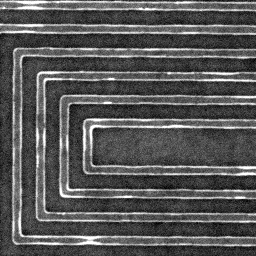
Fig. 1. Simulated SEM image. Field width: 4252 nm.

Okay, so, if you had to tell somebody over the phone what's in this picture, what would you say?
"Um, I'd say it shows groups of lines, slits or small figures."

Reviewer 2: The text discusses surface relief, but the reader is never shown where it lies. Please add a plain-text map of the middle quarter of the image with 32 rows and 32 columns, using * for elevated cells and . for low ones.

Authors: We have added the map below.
................................
................................
********************************
********************************
................................
................................
................................
................................
********************************
********************************
*...............................
*...............................
*...............................
*...............................
*....***************************
*....***.*******************.***
*....**.........................
*....**.........................
*....**.........................
*....**.........................
*....**.........................
*....**.........................
*....**.........................
*....**.........................
*....**.........................
*....**.........................
*....***************************
*..........*********************
*...............................
*...............................
*...............................
**.*************...*****....***.